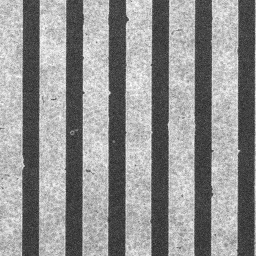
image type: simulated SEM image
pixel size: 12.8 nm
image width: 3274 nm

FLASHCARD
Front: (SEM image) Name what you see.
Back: parallel lines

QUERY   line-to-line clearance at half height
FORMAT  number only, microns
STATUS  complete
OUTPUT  0.232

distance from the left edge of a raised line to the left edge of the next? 547 nm